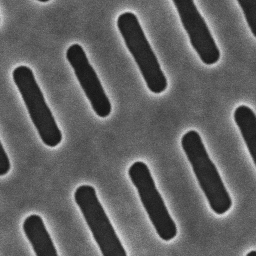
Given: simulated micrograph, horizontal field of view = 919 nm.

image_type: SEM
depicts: holes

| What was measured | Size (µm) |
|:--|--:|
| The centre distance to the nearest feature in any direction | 0.216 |